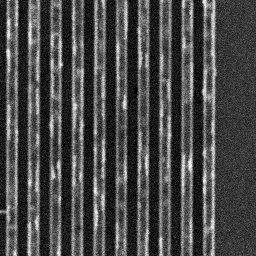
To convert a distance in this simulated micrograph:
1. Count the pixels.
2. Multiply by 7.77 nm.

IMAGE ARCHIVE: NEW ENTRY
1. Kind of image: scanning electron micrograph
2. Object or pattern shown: parallel lines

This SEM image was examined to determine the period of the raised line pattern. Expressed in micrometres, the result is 0.17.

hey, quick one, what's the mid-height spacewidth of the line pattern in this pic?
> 93.8 nanometers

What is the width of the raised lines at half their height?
74.8 nanometres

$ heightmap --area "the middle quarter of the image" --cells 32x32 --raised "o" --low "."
..ooo...oo...oo....oo...ooo...oo
..ooo...oo...oo....oo...ooo...oo
..ooo...oo...oo....oo...ooo...oo
..ooo...oo...oo....oo...ooo...oo
..ooo...oo...oo....oo...ooo...oo
..ooo...oo...oo....oo...ooo...oo
..ooo...oo...oo....oo...ooo...oo
..ooo...oo...oo....oo...ooo...oo
..ooo...oo...oo....oo...ooo...oo
..ooo...oo...oo....oo...ooo...oo
..ooo...oo...oo....oo...ooo...oo
..ooo...oo...oo....oo...ooo...oo
..ooo...oo...oo....oo...ooo...oo
..ooo...oo...oo....oo...oo....oo
..ooo...oo...oo....oo...oo....oo
..ooo...oo...oo....oo...oo....oo
..ooo...oo...oo....oo...oo....oo
..ooo...oo...oo....oo...ooo...oo
..ooo...oo...oo....oo...oo....oo
..ooo...oo...oo....oo...oo....oo
..ooo...oo...oo....oo...oo....oo
..oo....oo...oo....oo...oo....oo
..oo....oo...oo....oo...oo....oo
..oo....oo...oo....oo...oo....oo
..oo....oo...oo....oo...oo....oo
..oo....oo...oo....oo...oo....oo
..oo....oo...ooo...oo...oo....oo
..oo....oo...ooo...oo...oo....oo
..oo....oo...ooo...oo...oo....oo
..oo....oo...oo....oo...oo....oo
..oo....oo...oo....oo...oo....oo
..oo....oo...oo....oo...oo....oo